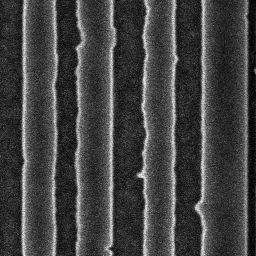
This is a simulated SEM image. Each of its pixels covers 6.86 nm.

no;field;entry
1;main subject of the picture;one or a few lines or trenches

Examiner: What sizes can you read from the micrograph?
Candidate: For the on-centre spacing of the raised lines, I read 424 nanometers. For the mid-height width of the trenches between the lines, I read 195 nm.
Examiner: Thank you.